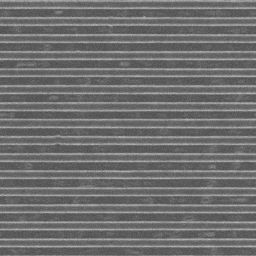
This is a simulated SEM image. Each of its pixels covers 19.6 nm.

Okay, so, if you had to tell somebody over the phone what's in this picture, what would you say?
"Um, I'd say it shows parallel lines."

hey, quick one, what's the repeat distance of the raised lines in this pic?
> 334 nanometres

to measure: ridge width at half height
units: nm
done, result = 144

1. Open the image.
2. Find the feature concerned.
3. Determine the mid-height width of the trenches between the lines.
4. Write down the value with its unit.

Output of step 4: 0.181 µm